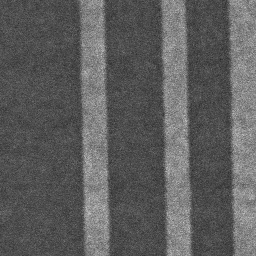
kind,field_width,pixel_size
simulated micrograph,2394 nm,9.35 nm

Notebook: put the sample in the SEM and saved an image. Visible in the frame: one or a few lines or trenches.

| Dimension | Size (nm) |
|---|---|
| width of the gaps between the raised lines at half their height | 494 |